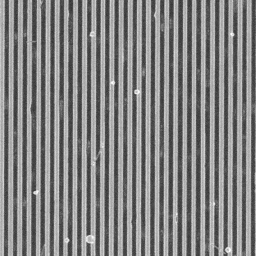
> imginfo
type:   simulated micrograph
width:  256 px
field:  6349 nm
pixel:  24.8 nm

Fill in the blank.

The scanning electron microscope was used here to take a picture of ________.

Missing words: parallel lines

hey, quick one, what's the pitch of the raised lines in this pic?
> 9.15 pixels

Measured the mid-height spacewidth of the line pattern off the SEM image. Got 121 nanometers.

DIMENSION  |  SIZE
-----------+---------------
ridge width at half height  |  105 nanometres